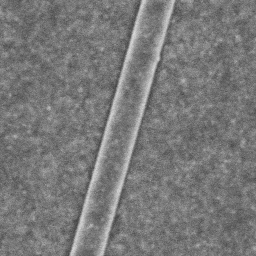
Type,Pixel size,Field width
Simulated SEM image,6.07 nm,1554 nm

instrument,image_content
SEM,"one or a few lines or trenches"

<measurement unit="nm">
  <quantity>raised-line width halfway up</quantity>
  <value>191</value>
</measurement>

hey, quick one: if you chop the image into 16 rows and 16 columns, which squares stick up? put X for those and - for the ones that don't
---------XX-----
--------XX------
--------XX------
--------XX------
--------XX------
-------XX-------
-------XX-------
-------XX-------
------XXX-------
------XX--------
------XX--------
------XX--------
-----XX---------
-----XX---------
-----XX---------
-----XX---------